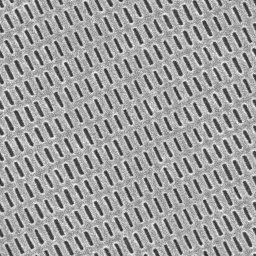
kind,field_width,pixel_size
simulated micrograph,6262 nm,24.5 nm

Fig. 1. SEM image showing a regular array of holes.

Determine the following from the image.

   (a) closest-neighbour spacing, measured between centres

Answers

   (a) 266 nm